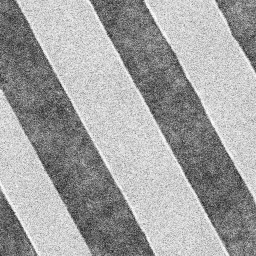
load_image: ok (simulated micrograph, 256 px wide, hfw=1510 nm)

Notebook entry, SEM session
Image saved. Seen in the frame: one or a few lines or trenches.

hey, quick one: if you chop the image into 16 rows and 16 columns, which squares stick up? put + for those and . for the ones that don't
.+++++...+++++..
..++++....++++..
..+++++...+++++.
...++++....++++.
....++++....++++
....++++....++++
+....++++....+++
+....+++++...+++
++....++++....++
++....+++++...++
+++....++++....+
+++....+++++...+
.+++....++++....
.+++....+++++...
..+++....++++...
..++++....++++..